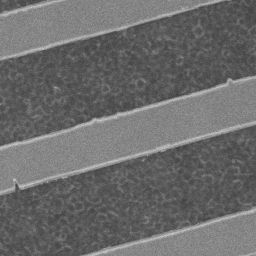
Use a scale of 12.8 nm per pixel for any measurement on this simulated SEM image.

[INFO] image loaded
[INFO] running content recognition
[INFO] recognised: one or a few lines or trenches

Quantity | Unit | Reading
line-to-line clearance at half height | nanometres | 1080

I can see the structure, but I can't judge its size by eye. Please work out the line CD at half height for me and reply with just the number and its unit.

544 nm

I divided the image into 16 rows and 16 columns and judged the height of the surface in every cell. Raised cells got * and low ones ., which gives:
..**********....
********........
*****...........
*...............
................
..............**
..........******
......**********
...**********...
*********.......
******..........
**..............
................
...............*
...........*****
.......*********